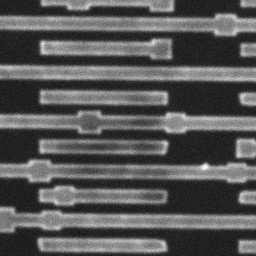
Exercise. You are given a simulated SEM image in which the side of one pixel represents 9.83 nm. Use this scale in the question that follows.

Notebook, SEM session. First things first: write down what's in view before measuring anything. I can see wiring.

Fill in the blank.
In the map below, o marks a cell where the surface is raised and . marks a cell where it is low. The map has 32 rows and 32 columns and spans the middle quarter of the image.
................................
oooooooooooooooooooooooooooooooo
oooooooooooooooooooooooooooooooo
oooooooooooooooooooooooooooooooo
................................
................................
................................
oooooooooooooooooooooooooo......
oooooooooooooooooooooooooo......
oooooooooooooooooooooooooo......
................................
................................
....ooooo.................oo....
oooooooooooooooooooooooooooooooo
oooooooooooooooooooooooooooooooo
oooooooooooooooooooooooooooooooo
....ooooo.................oooo..
................................
................................
ooooooooooooooooooooooooo.......
oooooooooooooooooooooooooo......
ooooooooooooooooooooooooo.......
................................
................................
................................
ooooooooooooooooo...............
oooooooooooooooooooooooooooooooo
oooooooooooooooooooooooooooooooo
................................
................................
................................
ooo.............................